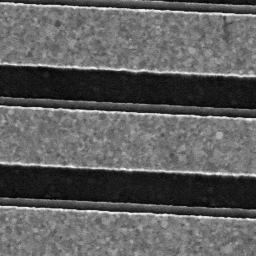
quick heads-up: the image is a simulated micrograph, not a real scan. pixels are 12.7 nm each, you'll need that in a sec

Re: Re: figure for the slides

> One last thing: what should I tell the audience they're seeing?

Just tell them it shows lines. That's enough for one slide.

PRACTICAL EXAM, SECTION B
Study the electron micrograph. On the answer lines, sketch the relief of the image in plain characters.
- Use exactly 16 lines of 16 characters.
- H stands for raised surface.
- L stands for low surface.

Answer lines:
HHHHHHLLLLLLLLLL
HHHHHHHHHHHHHHHH
HHHHHHHHHHHHHHHH
HHHHHHHHHHHHHHHH
LLLLLLLLLHHHHHHH
LLLLLLLLLLLLLLLL
LLLLLLLLLLLLLLLL
HHHHHHHHHHHHHHHH
HHHHHHHHHHHHHHHH
HHHHHHHHHHHHHHHH
LLLLLHHHHHHHHHHH
LLLLLLLLLLLLLLLL
LLLLLLLLLLLLLLLL
HHHHHHHHHHHHHLLL
HHHHHHHHHHHHHHHH
HHHHHHHHHHHHHHHH